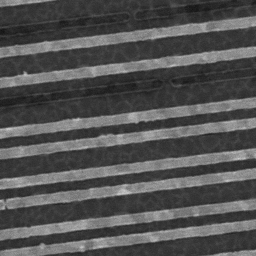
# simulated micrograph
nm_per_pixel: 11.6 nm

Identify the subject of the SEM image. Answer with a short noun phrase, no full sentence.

parallel lines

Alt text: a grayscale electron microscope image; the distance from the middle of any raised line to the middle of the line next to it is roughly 0.29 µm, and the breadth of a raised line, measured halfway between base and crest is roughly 9.18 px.